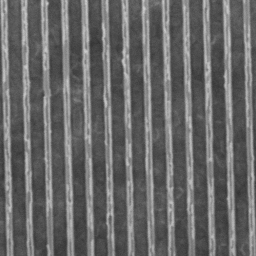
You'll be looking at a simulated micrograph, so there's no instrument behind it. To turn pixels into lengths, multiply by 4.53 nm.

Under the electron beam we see parallel lines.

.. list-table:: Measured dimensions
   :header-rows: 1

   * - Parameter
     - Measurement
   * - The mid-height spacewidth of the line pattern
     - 65.6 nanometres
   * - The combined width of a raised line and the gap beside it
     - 0.0915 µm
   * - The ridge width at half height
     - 27.2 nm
